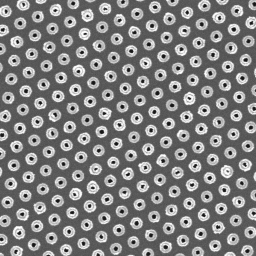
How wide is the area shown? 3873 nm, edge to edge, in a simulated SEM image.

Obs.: a regular array of ring-shaped raised bodies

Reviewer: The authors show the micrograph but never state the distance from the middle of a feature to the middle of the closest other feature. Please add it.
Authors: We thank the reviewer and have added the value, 280 nm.